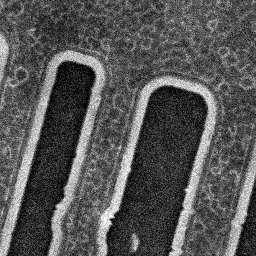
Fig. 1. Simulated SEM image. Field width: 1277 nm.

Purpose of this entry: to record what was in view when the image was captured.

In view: one or a few lines or trenches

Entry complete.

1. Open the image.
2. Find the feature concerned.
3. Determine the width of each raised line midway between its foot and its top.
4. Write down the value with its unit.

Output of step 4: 239 nm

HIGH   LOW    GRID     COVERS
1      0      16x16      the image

1111111111111111
1111111111111111
1111111111111111
1111111111111111
1110001111111111
1110001110001111
1110001110000111
1100001110000111
1100011100000111
1100011100000111
1100011100001111
1000011100001111
1000111000001110
1000111000001110
0000110000011110
0001110000011100